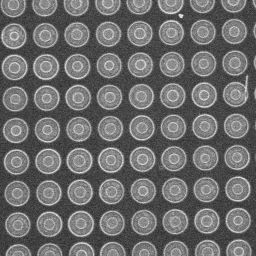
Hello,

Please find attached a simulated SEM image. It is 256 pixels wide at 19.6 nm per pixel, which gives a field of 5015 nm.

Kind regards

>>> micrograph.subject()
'an array of small figures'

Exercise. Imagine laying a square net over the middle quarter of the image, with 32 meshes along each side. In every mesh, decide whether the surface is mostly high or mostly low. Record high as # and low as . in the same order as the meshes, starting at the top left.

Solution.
......##......##......##......##
......###.....##......##......##
#.....###....####....####....###
###.############################
################################
###.#######.######..######...###
#.....###.....###.....###.....##
#.....###.....###.....##......##
#.....##......##......##......##
#.....###.....###.....###.....##
##...####....#####...#####...###
################################
################################
###.######...#####...#####...###
##....###.....###.....###.....##
#.....###.....###.....##......##
#......##......##.....###.....##
#.....###.....###.....###.....##
##...#####...#####...#####..####
################################
################################
###..#####...#####...#####...###
#.....###.....###.....###.....##
#......##......##......##.....##
#......##......##.....###.....##
#......##.....###.....###.....##
##....####...######..######.####
################################
################################
###..#####...#####....####....##
##....###.....###.....###.....##
#......##......##......##......#